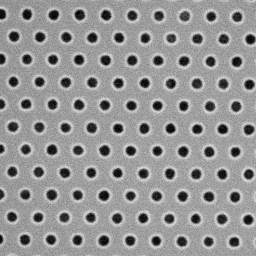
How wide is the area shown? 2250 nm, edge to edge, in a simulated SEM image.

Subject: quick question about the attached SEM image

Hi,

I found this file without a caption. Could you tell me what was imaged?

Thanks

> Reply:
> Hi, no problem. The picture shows a regular array of holes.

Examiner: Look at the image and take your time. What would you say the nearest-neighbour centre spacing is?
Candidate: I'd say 226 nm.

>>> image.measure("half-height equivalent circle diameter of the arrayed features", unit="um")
0.0967